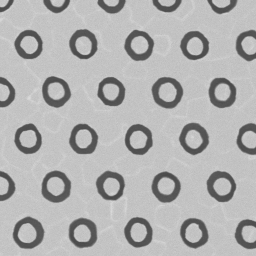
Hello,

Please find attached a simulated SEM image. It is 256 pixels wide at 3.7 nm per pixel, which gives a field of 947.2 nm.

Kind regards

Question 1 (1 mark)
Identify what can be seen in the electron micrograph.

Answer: a regular array of ring-shaped grooves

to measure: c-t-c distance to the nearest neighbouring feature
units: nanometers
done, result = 196